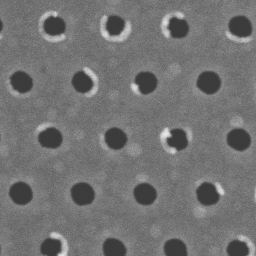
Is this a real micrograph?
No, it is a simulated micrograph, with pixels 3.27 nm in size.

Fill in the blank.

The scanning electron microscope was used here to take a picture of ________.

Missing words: a regular array of holes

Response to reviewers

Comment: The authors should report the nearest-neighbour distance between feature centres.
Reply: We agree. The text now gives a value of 0.202 microns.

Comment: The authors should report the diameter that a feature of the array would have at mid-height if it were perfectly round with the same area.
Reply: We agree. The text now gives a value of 23.1 pixels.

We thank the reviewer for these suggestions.